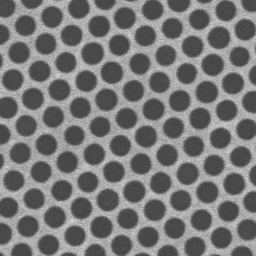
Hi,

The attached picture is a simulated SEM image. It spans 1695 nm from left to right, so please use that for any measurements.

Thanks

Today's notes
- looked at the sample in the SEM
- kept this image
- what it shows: a regular array of holes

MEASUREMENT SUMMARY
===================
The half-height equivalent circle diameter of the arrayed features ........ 145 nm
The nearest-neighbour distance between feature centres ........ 180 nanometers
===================